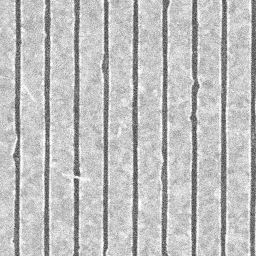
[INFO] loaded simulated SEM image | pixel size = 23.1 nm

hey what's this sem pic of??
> parallel lines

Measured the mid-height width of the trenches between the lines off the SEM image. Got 150 nm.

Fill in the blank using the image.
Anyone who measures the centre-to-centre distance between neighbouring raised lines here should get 682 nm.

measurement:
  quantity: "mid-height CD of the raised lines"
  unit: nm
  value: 538